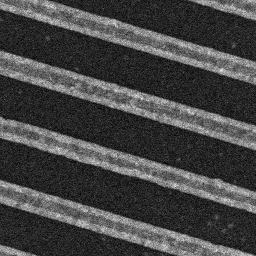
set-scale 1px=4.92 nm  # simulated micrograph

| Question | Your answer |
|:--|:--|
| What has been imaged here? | one or a few lines or trenches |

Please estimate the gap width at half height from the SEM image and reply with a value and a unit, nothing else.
229 nanometers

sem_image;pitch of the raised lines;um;0.305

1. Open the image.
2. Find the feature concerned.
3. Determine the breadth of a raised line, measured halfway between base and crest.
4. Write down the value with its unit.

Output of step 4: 77.8 nm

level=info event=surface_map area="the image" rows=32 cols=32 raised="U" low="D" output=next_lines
UUUUUUDDDDDDDDDDDDDDDDDDDDUUUUUU
DDDUUUUUUUDDDDDDDDDDDDDDDDDDDDUU
DDDDDDUUUUUUUDDDDDDDDDDDDDDDDDDD
DDDDDDDDDUUUUUUUDDDDDDDDDDDDDDDD
DDDDDDDDDDDDDUUUUUUUDDDDDDDDDDDD
DDDDDDDDDDDDDDDDUUUUUUUDDDDDDDDD
DDDDDDDDDDDDDDDDDDDDUUUUUUDDDDDD
UUUDDDDDDDDDDDDDDDDDDDDUUUUUUUDD
UUUUUUDDDDDDDDDDDDDDDDDDDDUUUUUU
DDUUUUUUUUDDDDDDDDDDDDDDDDDDDDUU
DDDDDDUUUUUUUDDDDDDDDDDDDDDDDDDD
DDDDDDDDDUUUUUUUUDDDDDDDDDDDDDDD
DDDDDDDDDDDDUUUUUUUUDDDDDDDDDDDD
DDDDDDDDDDDDDDDDUUUUUUUDDDDDDDDD
DDDDDDDDDDDDDDDDDDDUUUUUUUDDDDDD
UUDDDDDDDDDDDDDDDDDDDDUUUUUUUUDD
UUUUUDDDDDDDDDDDDDDDDDDDDDUUUUUU
DDDUUUUUUDDDDDDDDDDDDDDDDDDDDUUU
DDDDDDUUUUUUDDDDDDDDDDDDDDDDDDDD
DDDDDDDDDUUUUUUDDDDDDDDDDDDDDDDD
DDDDDDDDDDDDDUUUUUUDDDDDDDDDDDDD
DDDDDDDDDDDDDDDDUUUUUUDDDDDDDDDD
DDDDDDDDDDDDDDDDDDDDUUUUUUDDDDDD
UUDDDDDDDDDDDDDDDDDDDDDUUUUUUDDD
UUUUUDDDDDDDDDDDDDDDDDDDDDUUUUUU
DDUUUUUUUDDDDDDDDDDDDDDDDDDDDUUU
DDDDDUUUUUUUDDDDDDDDDDDDDDDDDDDD
DDDDDDDDDUUUUUUDDDDDDDDDDDDDDDDD
DDDDDDDDDDDDUUUUUUUDDDDDDDDDDDDD
DDDDDDDDDDDDDDDUUUUUUUDDDDDDDDDD
DDDDDDDDDDDDDDDDDDDUUUUUUUDDDDDD
UUDDDDDDDDDDDDDDDDDDDDUUUUUUUDDD